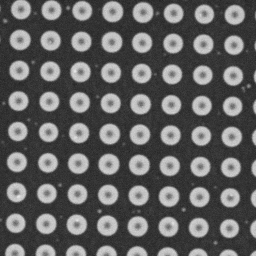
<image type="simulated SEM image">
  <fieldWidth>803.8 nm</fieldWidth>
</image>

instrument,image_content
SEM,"an array of small figures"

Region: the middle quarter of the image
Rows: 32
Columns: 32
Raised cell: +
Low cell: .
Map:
..++++....++++....+++.....++....
..++++...+++++...+++++...++++...
..++++...+++++...+++++...++++...
..++++....++++...+++++...++++...
...........++.....+++.....++....
................................
................................
...++......+....................
..++++....++++...++++....+++....
..++++...+++++...+++++...++++...
..++++...+++++...+++++...++++...
..++++....+++....++++....++++...
................................
................................
................................
..+++.....+++.....++............
.+++++...+++++...++++....++++...
.+++++...+++++...++++...+++++...
..++++...+++++...++++...+++++...
...++.....+++....++++....+++....
................................
................................
...+............................
.+++++...++++....++++....+++....
.+++++...+++++..+++++...+++++...
.+++++...+++++..+++++...+++++...
..+++....++++....++++...+++++...
...........+......++.....+++....
................................
................................
..+++.....++....................
.+++++...++++....++++...++++....